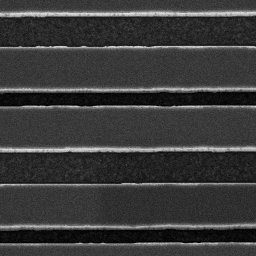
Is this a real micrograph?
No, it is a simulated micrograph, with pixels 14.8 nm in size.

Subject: lines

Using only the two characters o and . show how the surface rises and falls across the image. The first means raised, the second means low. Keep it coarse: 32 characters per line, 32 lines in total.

oooooooooooooooooooooooooooooooo
oooooooooooooooooooooooooooooooo
................................
................................
................................
................................
oooooooooooooooooooooooooooooooo
oooooooooooooooooooooooooooooooo
oooooooooooooooooooooooooooooooo
oooooooooooooooooooooooooooooooo
oooooooooooooooooooooooooooooooo
................................
................................
oooooooooooooooooooooooooooooooo
oooooooooooooooooooooooooooooooo
oooooooooooooooooooooooooooooooo
oooooooooooooooooooooooooooooooo
oooooooooooooooooooooooooooooooo
oooooooooooooooooooooooooooooooo
................................
................................
................................
................................
oooooooooooooooooooooooooooooooo
oooooooooooooooooooooooooooooooo
oooooooooooooooooooooooooooooooo
oooooooooooooooooooooooooooooooo
oooooooooooooooooooooooooooooooo
oooooooooooooooooooo....o.......
................................
.........oooo....ooooooooooooooo
oooooooooooooooooooooooooooooooo